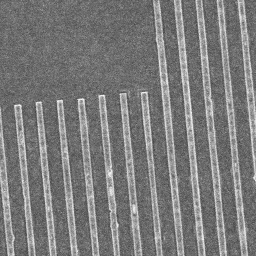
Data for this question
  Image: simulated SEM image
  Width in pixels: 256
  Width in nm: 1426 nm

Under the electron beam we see parallel lines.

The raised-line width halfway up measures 36 nanometers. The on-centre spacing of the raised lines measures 118 nanometres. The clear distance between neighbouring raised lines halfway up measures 81.8 nanometres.